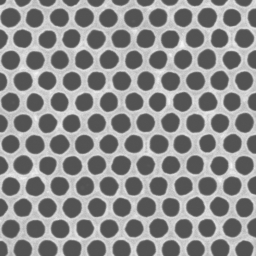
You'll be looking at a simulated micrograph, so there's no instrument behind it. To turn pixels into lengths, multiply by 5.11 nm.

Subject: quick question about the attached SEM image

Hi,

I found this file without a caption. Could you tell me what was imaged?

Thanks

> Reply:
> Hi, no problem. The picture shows a regular array of holes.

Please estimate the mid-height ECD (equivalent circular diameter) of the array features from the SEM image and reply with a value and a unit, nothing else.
93 nm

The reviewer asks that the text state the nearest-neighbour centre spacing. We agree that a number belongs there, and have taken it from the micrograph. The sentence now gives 122 nm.